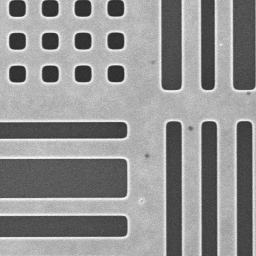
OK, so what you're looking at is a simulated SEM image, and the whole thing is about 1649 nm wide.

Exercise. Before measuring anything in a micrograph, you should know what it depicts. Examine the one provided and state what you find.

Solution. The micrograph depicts groups of lines, slits or small figures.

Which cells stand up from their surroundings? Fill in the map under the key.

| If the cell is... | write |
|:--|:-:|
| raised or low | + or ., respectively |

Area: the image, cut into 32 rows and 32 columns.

+..++..++..++..+++++...++..++...
+..++..++..++..+++++...++..++...
++++++++++++++++++++...++..++...
++++++++++++++++++++...++..++...
+..++..++..+++.+++++...++..++...
+..++..++..++..+++++...++..++...
++++++++++++++++++++...++..++...
++++++++++++++++++++...++..++...
+..++..++..+++.+++++...++..++...
+..++..++..++...++++...++..++...
++++++++++++++++++++...++..++...
++++++++++++++++++++++++++++++++
++++++++++++++++++++++++++++++++
++++++++++++++++++++++++++++++++
++++++++++++++++++++++++++++++++
................+++++..++..+++.+
................+++++..++..++...
+++++++++++++++++++++..++..++...
+++++++++++++++++++++..++..++...
+++++++++++++++++++++..++..++...
................+++++..++..++...
................+++++..++..++...
................+++++..++..++...
................+++++..++..++...
................+++++..++..++...
+++++++++++++++++++++..++..++...
+++++++++++++++++++++..++..++...
................+++++..++..++...
................+++++..++..+++..
...............++++++..++..+++..
+++++++++++++++++++++..++..+++..
+++++++++++++++++++++..++..+++..